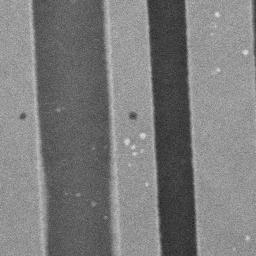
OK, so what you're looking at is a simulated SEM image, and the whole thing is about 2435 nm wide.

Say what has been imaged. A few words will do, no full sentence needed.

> lines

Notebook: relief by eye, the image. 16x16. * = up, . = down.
**.....**...****
**.....**...****
**.....**...****
**.....**...****
**.....**...****
**.....***..****
**.....***..****
**.....***..****
**.....***..****
**.....***..****
**.....***..****
***....***..****
***....***..****
***....***..****
***....***..****
***....***..****